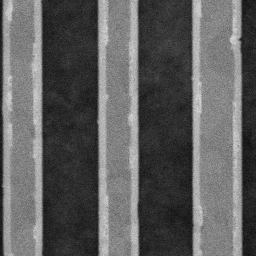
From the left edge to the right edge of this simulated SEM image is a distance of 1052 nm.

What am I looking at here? one or a few lines or trenches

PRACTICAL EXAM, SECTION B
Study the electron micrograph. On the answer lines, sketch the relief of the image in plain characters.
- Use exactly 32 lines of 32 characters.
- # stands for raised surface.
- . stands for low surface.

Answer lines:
.####........####........#####..
.####........####........#####..
.####........####........#####..
.####........####........#####..
.####........####........#####..
.####........####........#####..
.####........####........#####..
.####........####........#####..
.####........####........#####..
.####........####........#####..
.####........####........#####..
.####........####........#####..
.####........####........#####..
.####........####........#####..
.####........####........#####..
.####........####........#####..
.####........####........#####..
.####........####........#####..
.####........####........#####..
.####........####........#####..
.####........####........#####..
.####........####........#####..
.####........####........#####..
.####........####........#####..
.####........####........#####..
.####........####........#####..
.####........####........#####..
.####........####........#####..
.####........####........#####..
.####........####........#####..
.####........####........#####..
.####........####........#####..